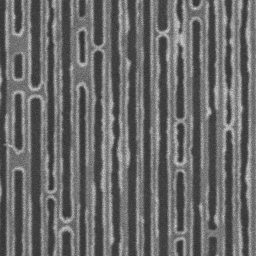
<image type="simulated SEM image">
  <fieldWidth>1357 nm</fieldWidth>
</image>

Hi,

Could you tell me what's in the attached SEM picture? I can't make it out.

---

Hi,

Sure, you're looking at parallel lines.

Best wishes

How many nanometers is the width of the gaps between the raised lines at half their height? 41.1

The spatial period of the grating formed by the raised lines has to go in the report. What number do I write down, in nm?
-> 85.6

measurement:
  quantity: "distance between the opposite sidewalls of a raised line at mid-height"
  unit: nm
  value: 45.7